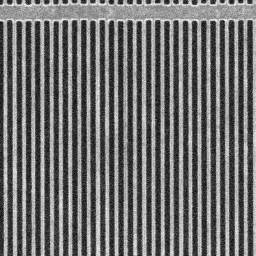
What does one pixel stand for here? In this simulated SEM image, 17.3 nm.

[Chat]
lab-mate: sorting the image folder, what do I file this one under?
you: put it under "parallel lines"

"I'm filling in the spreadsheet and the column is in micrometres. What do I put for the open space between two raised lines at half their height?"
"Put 0.114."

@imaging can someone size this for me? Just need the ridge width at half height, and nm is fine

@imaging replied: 49.7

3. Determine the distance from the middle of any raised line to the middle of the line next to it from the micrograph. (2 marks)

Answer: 159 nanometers